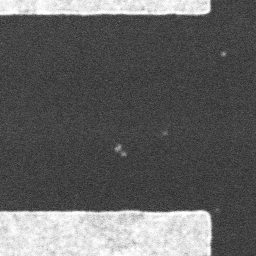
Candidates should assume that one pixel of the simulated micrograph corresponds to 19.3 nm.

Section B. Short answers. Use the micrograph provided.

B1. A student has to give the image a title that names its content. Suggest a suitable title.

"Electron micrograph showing wiring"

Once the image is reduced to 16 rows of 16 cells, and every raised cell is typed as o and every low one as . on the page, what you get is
ooooooooooooo...
................
................
................
................
................
................
................
................
................
................
................
................
ooooooooooooo...
ooooooooooooo...
ooooooooooooo...